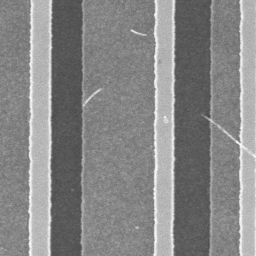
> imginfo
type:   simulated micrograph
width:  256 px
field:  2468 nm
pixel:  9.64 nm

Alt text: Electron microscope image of lines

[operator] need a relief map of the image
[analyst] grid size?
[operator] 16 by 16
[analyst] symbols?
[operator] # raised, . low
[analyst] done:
###..######..###
###..######..###
###..######..###
###..######..###
###..######..###
###..######..###
###..######..###
###..######..###
###..######..###
###..######..###
###..######..###
###..######..###
###..######..###
###..######..###
###..######..###
###..######..###